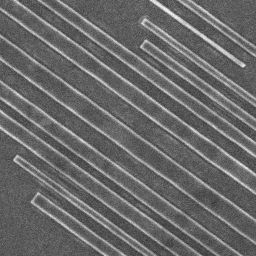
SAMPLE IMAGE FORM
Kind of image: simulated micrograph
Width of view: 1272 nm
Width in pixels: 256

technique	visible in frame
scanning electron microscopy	groups of lines, slits or small figures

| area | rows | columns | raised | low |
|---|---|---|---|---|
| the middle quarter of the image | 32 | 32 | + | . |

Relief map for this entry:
...+++++++......++++++....+++...
.....+++++++......+++++....++++.
.......++++++......+++++.....+++
........+++++++.....++++++....++
.........+++++++......+++++....+
+..........++++++......+++++....
+++.........+++++++......+++++..
++++.........+++++++......+++++.
++++++.........+++++++.....+++++
+++++++.........+++++++......+++
++++++++.........+++++++......++
..++++++++.........+++++++......
...++++++++.........+++++++.....
....+++++++++........++++++++...
......++++++++.........+++++++..
.......++++++++.........+++++++.
+........++++++++.........++++++
++........++++++++.........+++++
++++.......++++++++.........++++
+++++........++++++++.........++
+++++++.......++++++++.........+
..++++++........++++++++........
...++++++........++++++++.......
+...+++++++.......++++++++......
++....++++++.......+++++++++....
+++....++++++........++++++++...
+++++....++++++.......+++++++++.
++++++....++++++........++++++++
.++++++.....++++++.......+++++++
...++++++....++++++........+++++
....++++++....++++++........++++
+.....++++++....++++++.......+++